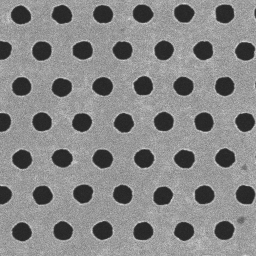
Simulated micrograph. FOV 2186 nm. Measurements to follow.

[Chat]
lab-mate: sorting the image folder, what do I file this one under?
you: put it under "a regular array of holes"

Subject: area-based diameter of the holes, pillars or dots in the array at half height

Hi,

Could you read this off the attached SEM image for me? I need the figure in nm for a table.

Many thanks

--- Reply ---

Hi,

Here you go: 164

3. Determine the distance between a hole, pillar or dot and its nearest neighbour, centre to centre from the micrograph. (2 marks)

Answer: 343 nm